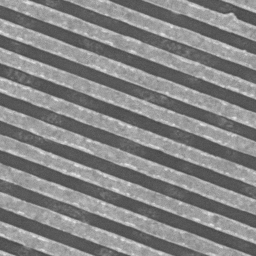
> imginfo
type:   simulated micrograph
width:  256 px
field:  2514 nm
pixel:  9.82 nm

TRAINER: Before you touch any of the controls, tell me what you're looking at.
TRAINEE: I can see parallel lines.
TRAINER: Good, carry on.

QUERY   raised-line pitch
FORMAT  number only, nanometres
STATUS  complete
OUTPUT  266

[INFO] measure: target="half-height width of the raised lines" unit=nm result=134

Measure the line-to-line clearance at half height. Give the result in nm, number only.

134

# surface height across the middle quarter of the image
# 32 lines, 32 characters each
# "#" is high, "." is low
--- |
......##########..........######
.........##########..........###
##..........#########..........#
####..........##########........
#######..........##########.....
##########..........#########...
...#########..........##########
.....##########..........#######
........##########..........####
#..........##########..........#
####.........##########.........
######..........##########......
#########..........##########...
..##########..........#########.
.....#########..........########
.......##########..........#####
..........##########..........##
###..........##########.........
######.........##########.......
########..........##########....
..#########..........##########.
....##########..........########
.......#########..........######
..........#########..........###
##..........##########..........
#####..........##########.......
#######...........##########....
##########..........###########.
....#########..........#########
......##########..........######
.........##########..........###
##..........#########..........#